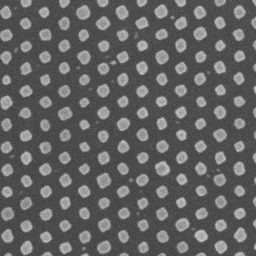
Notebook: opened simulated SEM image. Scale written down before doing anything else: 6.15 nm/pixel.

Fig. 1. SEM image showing a regular array of raised bodies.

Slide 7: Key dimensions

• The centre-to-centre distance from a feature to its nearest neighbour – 135 nm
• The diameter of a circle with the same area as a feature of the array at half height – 66.2 nanometers